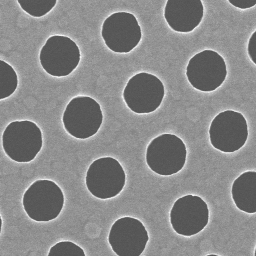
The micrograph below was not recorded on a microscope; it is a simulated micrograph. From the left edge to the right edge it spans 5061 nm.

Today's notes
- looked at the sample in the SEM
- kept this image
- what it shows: a regular array of holes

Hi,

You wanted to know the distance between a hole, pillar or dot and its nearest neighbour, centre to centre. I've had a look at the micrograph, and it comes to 1280 nm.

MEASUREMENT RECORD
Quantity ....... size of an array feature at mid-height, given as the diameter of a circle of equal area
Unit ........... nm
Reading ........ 798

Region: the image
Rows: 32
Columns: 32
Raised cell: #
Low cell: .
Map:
##.....##############....####...
###...###############....#######
#############....####....#######
#############.....####..########
#######.#####.....#############.
######...####....##############.
#####.....#####.#########..####.
#####.....##############....####
..###....##############.....####
..#####.#########..####.....####
..##############....####....####
..#############......###########
#########...####....############
########.....###....############
########.....##############...##
#...####.....#############.....#
.....####...##############.....#
.....##############....###.....#
.....#############.....####...##
#...##############.....#########
###########....###.....#########
###########.....###...#########.
#####.#####.....#############...
####...####....##############...
###.....####..#########.#####...
###.....##############....###...
###.....#############.....#####.
####..#########..####.....######
##############....####...#######
##############.....#############
#######..#####....##############
######....####....##############